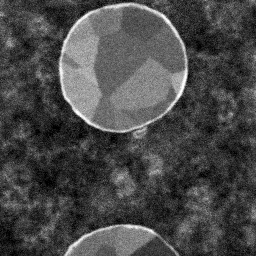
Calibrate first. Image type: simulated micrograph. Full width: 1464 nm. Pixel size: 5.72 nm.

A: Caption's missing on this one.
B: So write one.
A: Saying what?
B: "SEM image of raised bodies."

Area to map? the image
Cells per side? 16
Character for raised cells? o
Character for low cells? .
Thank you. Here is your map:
......ooo.......
.....oooooo.....
....ooooooo.....
....oooooooo....
....oooooooo....
....ooooooo.....
....ooooooo.....
.....ooooo......
................
................
................
................
................
................
......oooo......
....ooooooo.....